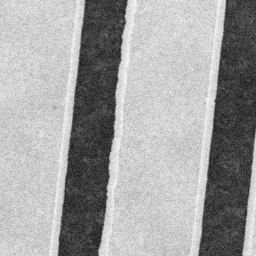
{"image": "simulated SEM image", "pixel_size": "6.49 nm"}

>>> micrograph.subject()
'one or a few lines or trenches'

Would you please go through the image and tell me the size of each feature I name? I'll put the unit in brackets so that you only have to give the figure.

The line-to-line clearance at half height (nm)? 332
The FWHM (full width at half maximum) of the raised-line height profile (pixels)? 89.6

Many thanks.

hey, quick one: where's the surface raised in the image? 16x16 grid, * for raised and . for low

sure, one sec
*****...******..
*****...******..
*****...******..
*****...*****...
*****...*****...
****....*****...
****...******...
****...******...
****...******...
****...******...
****...******...
****...******...
****...*****....
****...*****....
***....*****....
***....*****...*